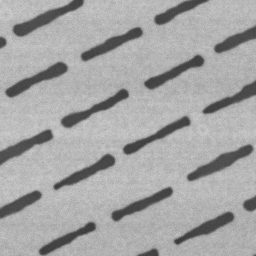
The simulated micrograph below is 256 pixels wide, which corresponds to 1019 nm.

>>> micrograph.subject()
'a regular array of holes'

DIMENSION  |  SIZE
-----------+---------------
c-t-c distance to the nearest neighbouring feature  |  259 nanometres